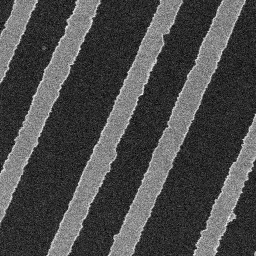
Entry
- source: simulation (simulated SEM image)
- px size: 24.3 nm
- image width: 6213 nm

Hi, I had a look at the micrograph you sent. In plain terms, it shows one or a few lines or trenches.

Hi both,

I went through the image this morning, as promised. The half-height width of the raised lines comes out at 0.482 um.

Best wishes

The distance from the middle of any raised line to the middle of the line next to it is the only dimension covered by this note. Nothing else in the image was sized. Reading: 1.6 um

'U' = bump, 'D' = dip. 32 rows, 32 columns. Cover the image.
DDUUDDDDDDUUDDDDDDDDUUUDDDDDUUDD
DUUUDDDDDUUUDDDDDDDDUUDDDDDUUUDD
DUUUDDDDDUUUDDDDDDDUUUDDDDDUUUDD
DUUDDDDDUUUDDDDDDDDUUDDDDDUUUDDD
UUUDDDDDUUUDDDDDDDUUDDDDDDUUUDDD
UUDDDDDUUUDDDDDDDDUUDDDDDUUUDDDD
UUDDDDDUUUDDDDDDDUUUDDDDDUUUDDDD
UDDDDDUUUDDDDDDDDUUUDDDDDUUDDDDD
UDDDDDUUUDDDDDDDUUUDDDDDUUUDDDDD
DDDDDUUUDDDDDDDDUUUDDDDDUUDDDDDD
DDDDDUUUDDDDDDDUUUDDDDDUUUDDDDDD
DDDDDUUDDDDDDDDUUUDDDDDUUDDDDDDD
DDDDUUUDDDDDDDDUUDDDDDUUUDDDDDDD
DDDDUUDDDDDDDDUUUDDDDDUUUDDDDDDD
DDDUUUDDDDDDDDUUDDDDDUUUDDDDDDDD
DDDUUDDDDDDDDUUUDDDDDUUUDDDDDDDD
DDUUUDDDDDDDDUUDDDDDDUUDDDDDDDDU
DDUUUDDDDDDDUUUDDDDDUUUDDDDDDDDU
DDUUDDDDDDDDUUDDDDDDUUDDDDDDDDUU
DUUUDDDDDDDUUUDDDDDUUUDDDDDDDDUU
DUUDDDDDDDDUUUDDDDDUUDDDDDDDDUUU
UUUDDDDDDDUUUDDDDDUUUDDDDDDDDUUD
UUDDDDDDDDUUUDDDDDUUUDDDDDDDUUUD
UUDDDDDDDDUUDDDDDUUUDDDDDDDDUUDD
UDDDDDDDDUUUDDDDDUUUDDDDDDDUUUDD
UDDDDDDDDUUDDDDDDUUDDDDDDDDUUDDD
UDDDDDDDUUUDDDDDUUUDDDDDDDUUUDDD
DDDDDDDDUUDDDDDDUUDDDDDDDDUUUDDD
DDDDDDDUUUDDDDDUUUDDDDDDDDUUDDDD
DDDDDDDUUUDDDDDUUDDDDDDDDUUUDDDD
DDDDDDUUUDDDDDUUUDDDDDDDDUUDDDDD
DDDDDDUUUDDDDDUUUDDDDDDDUUUDDDDD